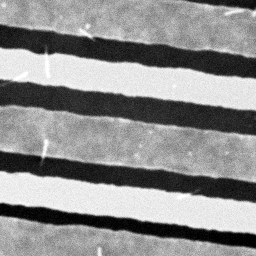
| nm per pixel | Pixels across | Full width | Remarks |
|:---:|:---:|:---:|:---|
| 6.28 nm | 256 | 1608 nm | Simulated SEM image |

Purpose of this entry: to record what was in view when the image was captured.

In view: lines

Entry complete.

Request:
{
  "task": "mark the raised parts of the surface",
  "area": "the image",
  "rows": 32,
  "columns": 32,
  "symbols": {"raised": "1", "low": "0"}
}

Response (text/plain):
11111111111111111111111110000000
11111111111111111111111111111111
11111111111111111111111111111111
00011111111111111111111111111111
00000000000111111111111111111111
00000000000000000000011111111111
11110000000000000000000000001111
11111111111100000000000000000000
11111111111111111111000000000000
11111111111111111111111111100000
00000111111111111111111111111111
00000000000001111111111111111111
00000000000000000000011111111111
11100000000000000000000000000111
11111111110000000000000000000000
11111111111111111111000000000000
11111111111111111111111111110000
11111111111111111111111111111111
11111111111111111111111111111111
00000111111111111111111111111111
00000000000001111111111111111111
10000000000000000000001111111111
11111111100000000000000000000011
11111111111111111000000000000000
11111111111111111111111100000000
00111111111111111111111111111111
00000000011111111111111111111111
11100000000000000111111111111111
11111111111100000000000001111111
11111111111111111110000000000000
11111111111111111111111111100000
11111111111111111111111111111111